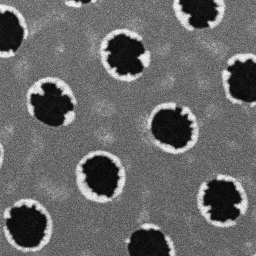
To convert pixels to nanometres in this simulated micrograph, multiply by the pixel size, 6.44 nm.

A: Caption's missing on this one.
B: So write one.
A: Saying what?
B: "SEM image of holes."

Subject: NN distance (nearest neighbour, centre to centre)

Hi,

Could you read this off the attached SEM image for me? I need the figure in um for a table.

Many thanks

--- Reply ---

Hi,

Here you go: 0.557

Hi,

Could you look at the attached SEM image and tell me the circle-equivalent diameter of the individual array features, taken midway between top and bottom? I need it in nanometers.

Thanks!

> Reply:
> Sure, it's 257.